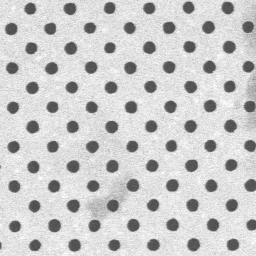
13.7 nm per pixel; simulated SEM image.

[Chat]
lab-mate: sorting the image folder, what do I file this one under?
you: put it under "a regular array of holes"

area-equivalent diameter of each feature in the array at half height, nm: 170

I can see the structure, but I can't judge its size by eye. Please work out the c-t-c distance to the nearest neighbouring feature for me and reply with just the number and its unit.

378 nm